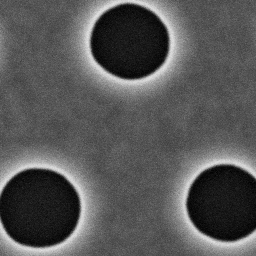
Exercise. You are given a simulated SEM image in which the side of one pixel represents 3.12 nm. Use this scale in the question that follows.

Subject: holes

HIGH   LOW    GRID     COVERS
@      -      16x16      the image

@@@@@@@--@@@@@@@
@@@@@@----@@@@@@
@@@@@@-----@@@@@
@@@@@@-----@@@@@
@@@@@@@---@@@@@@
@@@@@@@@@@@@@@@@
@@@@@@@@@@@@@@@@
@@@@@@@@@@@@@@@@
@@@@@@@@@@@@@@@@
@@@@@@@@@@@@@@@@
@@@@@@@@@@@@@--@
----@@@@@@@@----
-----@@@@@@@----
-----@@@@@@@----
-----@@@@@@@@---
@@@@@@@@@@@@@@@@